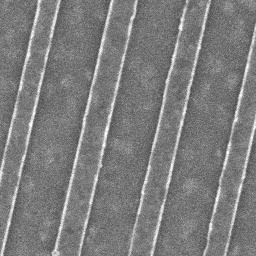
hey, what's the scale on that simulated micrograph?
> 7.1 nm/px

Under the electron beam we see one or a few lines or trenches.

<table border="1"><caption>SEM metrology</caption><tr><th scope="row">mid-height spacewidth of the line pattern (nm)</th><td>355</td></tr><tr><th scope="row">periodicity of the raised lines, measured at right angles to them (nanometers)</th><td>512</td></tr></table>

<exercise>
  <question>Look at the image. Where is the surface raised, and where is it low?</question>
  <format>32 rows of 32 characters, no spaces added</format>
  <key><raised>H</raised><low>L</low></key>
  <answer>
LLLLLHHLLLLLLLHHHLLLLLLHHHLLLLLH
LLLLLHHLLLLLLLHHHLLLLLLHHHLLLLLL
LLLLHHHLLLLLLHHHHLLLLLLHHHLLLLLL
LLLLHHHLLLLLLHHHLLLLLLHHHHLLLLLL
LLLLHHLLLLLLLHHHLLLLLLHHHLLLLLLL
LLLLHHLLLLLLLHHHLLLLLLHHHLLLLLLH
LLLHHHLLLLLLHHHHLLLLLLHHHLLLLLLH
LLLHHHLLLLLLHHHLLLLLLLHHHLLLLLLH
LLLHHHLLLLLLHHHLLLLLLHHHLLLLLLLH
LLLHHLLLLLLLHHHLLLLLLHHHLLLLLLLH
LLLHHLLLLLLLHHHLLLLLLHHHLLLLLLHH
LLHHHLLLLLLHHHHLLLLLLHHHLLLLLLHH
LLHHHLLLLLLHHHLLLLLLHHHLLLLLLLHH
LLHHLLLLLLLHHHLLLLLLHHHLLLLLLLHH
LLHHLLLLLLLHHHLLLLLLHHHLLLLLLHHH
LHHHLLLLLLHHHHLLLLLLHHHLLLLLLHHH
LHHHLLLLLLHHHLLLLLLLHHHLLLLLLHHH
LHHHLLLLLLHHHLLLLLLHHHLLLLLLLHHH
LHHLLLLLLLHHHLLLLLLHHHLLLLLLHHHL
HHHLLLLLLLHHHLLLLLLHHHLLLLLLHHHL
HHHLLLLLLHHHHLLLLLLHHHLLLLLLHHHL
HHHLLLLLLHHHLLLLLLHHHLLLLLLLHHHL
HHLLLLLLLHHHLLLLLLHHHLLLLLLLHHLL
HHLLLLLLLHHHLLLLLLHHHLLLLLLHHHLL
HHLLLLLLHHHHLLLLLLHHHLLLLLLHHHLL
HHLLLLLLHHHLLLLLLHHHHLLLLLLHHHLL
HHLLLLLLHHHLLLLLLHHHLLLLLLLHHLLL
HLLLLLLLHHHLLLLLLHHHLLLLLLHHHLLL
HLLLLLLHHHHLLLLLLHHHLLLLLLHHHLLL
HLLLLLLHHHHLLLLLLHHHLLLLLLHHHLLL
HLLLLLLHHHLLLLLLHHHLLLLLLLHHHLLL
LLLLLLLHHHLLLLLLHHHLLLLLLLHHHLLL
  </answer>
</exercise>